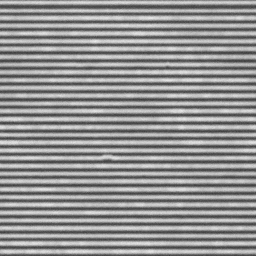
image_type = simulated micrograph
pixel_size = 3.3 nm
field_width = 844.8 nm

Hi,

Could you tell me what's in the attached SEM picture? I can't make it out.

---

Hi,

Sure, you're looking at parallel lines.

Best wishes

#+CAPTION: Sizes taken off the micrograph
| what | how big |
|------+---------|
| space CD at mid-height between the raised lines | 12 nanometres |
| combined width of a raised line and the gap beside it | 25.7 nanometers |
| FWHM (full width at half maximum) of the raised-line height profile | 14.8 nm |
